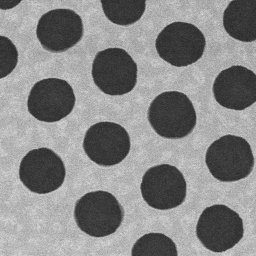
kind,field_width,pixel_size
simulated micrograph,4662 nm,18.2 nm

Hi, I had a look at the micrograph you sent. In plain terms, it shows a regular array of holes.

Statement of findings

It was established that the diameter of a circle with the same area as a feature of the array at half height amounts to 853 nm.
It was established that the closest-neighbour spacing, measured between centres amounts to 1.28 microns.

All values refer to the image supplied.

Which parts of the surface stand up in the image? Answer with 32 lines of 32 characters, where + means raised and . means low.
..+++++++++++.....+++++++++++...
++++++...++++.....++++++++++....
+++++.....++++...+++++++++++....
+++++.....+++++++++++....+++....
+++++.....++++++++++.....++++...
..+++....++++++++++.......++++++
..++++++++++....++++.....+++++++
..++++++++++.....+++.....+++++++
..+++++++++......++++++++++++..+
.+++++++++++.....++++++++++.....
++++.....+++.....++++++++++.....
++++.....++++...+++++.+++++.....
+++......++++++++++.....+++.....
++++.....++++++++++.....++++...+
++++....++++++++++......++++++++
++++++++++++...++++.....++++++++
+++++++++++.....++++....++++++++
++++++++++......+++++++++++....+
+++++.++++......++++++++++.....+
+++....++++.....++++++++++......
+++.....++++...+++++++++++......
++......++++++++++....++++.....+
+++.....++++++++++.....++++...++
+++....+++++++++++.....+++++++++
++++++++++....++++.....+++++++++
+++++++++......++++....+++++++++
+++++++++......++++++++++....+++
+++++++++......++++++++++.....++
++++++++++.....++++++++++.....++
++++++++++++.+++++...++++.....++
+++++++++++++++++.....+++.....++
++++++++++++++++......+++++.++++